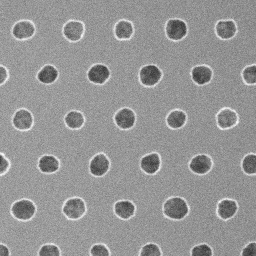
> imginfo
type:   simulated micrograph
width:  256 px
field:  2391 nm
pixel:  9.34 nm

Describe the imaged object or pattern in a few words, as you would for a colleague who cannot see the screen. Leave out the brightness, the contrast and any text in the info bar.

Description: a regular array of raised bodies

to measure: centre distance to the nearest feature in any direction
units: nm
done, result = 469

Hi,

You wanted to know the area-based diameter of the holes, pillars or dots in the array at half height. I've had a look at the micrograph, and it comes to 202 nm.